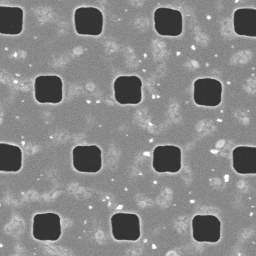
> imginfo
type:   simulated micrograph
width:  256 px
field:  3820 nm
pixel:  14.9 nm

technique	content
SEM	a regular array of holes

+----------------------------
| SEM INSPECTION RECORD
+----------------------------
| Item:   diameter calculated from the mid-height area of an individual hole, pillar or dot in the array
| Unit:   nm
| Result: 445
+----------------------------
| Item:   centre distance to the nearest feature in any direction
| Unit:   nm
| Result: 1180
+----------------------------